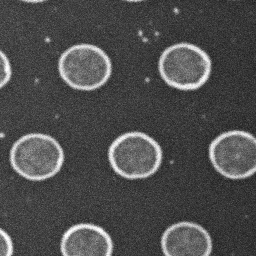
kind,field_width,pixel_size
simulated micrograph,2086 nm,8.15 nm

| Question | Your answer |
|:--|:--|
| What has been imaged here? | raised bodies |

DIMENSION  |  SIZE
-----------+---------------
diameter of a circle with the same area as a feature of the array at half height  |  378 nm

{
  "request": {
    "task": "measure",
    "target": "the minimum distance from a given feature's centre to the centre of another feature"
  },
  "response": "807 nm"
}